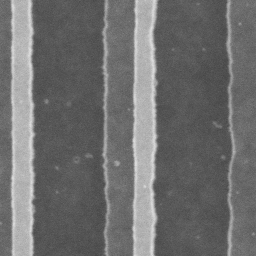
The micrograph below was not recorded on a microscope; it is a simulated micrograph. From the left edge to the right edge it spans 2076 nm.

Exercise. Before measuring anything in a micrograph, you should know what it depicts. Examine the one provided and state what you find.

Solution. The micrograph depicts lines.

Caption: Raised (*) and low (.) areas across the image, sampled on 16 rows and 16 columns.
**.....***....**
**.....***....**
**.....***....**
**.....***....**
**.....***....**
**.....***....**
**.....***....**
**.....***....**
**.....***....**
**.....***.....*
**.....***....**
**.....***....**
**.....***....**
**.....***....**
**.....***....**
**.....***....**